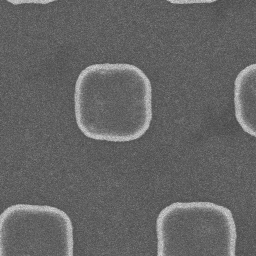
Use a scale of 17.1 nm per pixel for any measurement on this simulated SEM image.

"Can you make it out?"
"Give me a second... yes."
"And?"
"raised bodies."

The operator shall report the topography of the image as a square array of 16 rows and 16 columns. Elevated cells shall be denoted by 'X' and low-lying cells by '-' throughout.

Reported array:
----------------
----------------
----------------
----------------
-----XXXX------X
-----XXXX------X
-----XXXX------X
-----XXXX------X
------XXX-------
----------------
----------------
----------------
----------------
XXXX------XXXX--
XXXX------XXXXX-
XXXX------XXXXX-